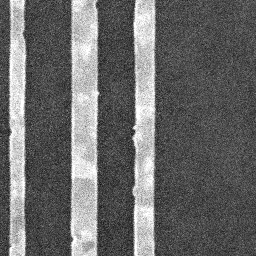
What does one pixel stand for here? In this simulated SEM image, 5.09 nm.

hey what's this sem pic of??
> one or a few lines or trenches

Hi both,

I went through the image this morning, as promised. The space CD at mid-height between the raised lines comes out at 224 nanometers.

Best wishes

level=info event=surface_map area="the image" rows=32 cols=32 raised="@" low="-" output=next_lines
-@@------@@@-----@@-------------
-@@------@@@-----@@-------------
-@@------@@@-----@@-------------
-@@------@@@-----@@-------------
-@@------@@@-----@@-------------
-@@------@@@-----@@-------------
-@@------@@@-----@@-------------
-@@------@@@-----@@-------------
-@@------@@@-----@@-------------
-@@------@@@-----@@-------------
-@@------@@@-----@@-------------
-@@------@@@-----@@-------------
-@@------@@@-----@@-------------
-@@------@@@-----@@-------------
-@@------@@@-----@@-------------
-@@------@@@-----@@-------------
-@@------@@@-----@@-------------
-@@------@@@-----@@-------------
-@@------@@@-----@@-------------
-@@------@@@-----@@-------------
-@@------@@@-----@@-------------
-@@------@@@-----@@-------------
-@@------@@@-----@@-------------
-@@------@@@-----@@-------------
-@@------@@@-----@@-------------
-@@------@@@-----@@-------------
-@@------@@@-----@@-------------
-@@------@@@-----@@-------------
-@@------@@@-----@@-------------
-@@------@@@-----@@-------------
-@@------@@@-----@@-------------
-@@------@@@-----@@-------------